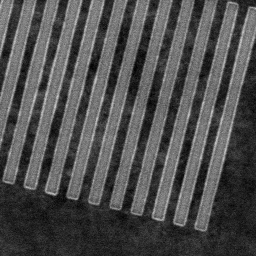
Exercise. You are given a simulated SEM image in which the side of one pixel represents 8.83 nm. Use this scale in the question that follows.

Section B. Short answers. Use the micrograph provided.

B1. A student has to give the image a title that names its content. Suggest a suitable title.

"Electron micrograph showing groups of lines, slits or small figures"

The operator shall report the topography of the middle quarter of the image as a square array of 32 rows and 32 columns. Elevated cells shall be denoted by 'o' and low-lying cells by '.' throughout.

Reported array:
ooo...ooo...oo...ooo...ooo..oooo
ooo...ooo..ooo...ooo...ooo..ooo.
ooo..ooo...ooo...ooo..ooo...ooo.
oo...ooo...ooo..ooo...ooo...ooo.
oo...ooo...ooo..ooo...ooo...oo..
oo...oo...ooo...ooo...ooo..ooo..
o....oo...ooo...ooo..ooo...ooo..
o...ooo...ooo...oo...ooo...ooo..
o...ooo...oo...ooo...ooo..oooo..
o...ooo..ooo...ooo...ooo..ooo...
o..ooo...ooo...ooo..ooo...ooo...
o..ooo...ooo..ooo...ooo...ooo...
...ooo...ooo..ooo...ooo..oooo..o
...ooo..ooo...ooo...ooo..ooo...o
..ooo...ooo...ooo..ooo...ooo...o
..ooo...ooo..ooo...ooo...ooo..oo
..ooo...ooo..ooo...ooo...oo...oo
..ooo..ooo...ooo...ooo..ooo...oo
.ooo...ooo...ooo...oo...ooo...oo
.ooo...ooo..oooo..ooo...ooo...oo
.ooo...ooo..ooo...ooo..oooo..ooo
.ooo..ooo...ooo...ooo..ooo...ooo
.oo...ooo...ooo..ooo...ooo...ooo
ooo...ooo...oo...ooo...ooo..ooo.
ooo..oooo..ooo...ooo...oo...ooo.
ooo..ooo...ooo...ooo..ooo...ooo.
oo...ooo...ooo..ooo...ooo...ooo.
oo...ooo..oooo..ooo...ooo...oo..
oo...oo...ooo...ooo...ooo..ooo..
oo..ooo...ooo...ooo..ooo...ooo..
o...ooo...ooo..ooo...ooo...ooo..
o...ooo...oo...ooo...ooo...ooo..